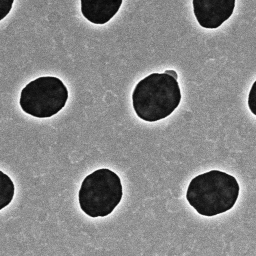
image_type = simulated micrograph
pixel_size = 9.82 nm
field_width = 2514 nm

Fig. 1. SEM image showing holes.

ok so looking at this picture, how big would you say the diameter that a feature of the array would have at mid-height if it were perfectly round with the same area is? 463 nm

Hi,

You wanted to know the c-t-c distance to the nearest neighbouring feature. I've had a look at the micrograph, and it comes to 1.09 um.